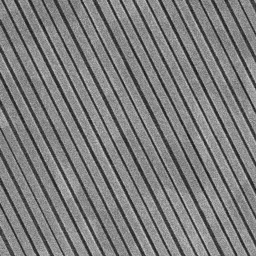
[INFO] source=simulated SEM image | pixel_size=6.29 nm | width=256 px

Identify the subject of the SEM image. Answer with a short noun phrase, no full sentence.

parallel lines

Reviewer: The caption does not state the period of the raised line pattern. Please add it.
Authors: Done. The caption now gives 73.9 nm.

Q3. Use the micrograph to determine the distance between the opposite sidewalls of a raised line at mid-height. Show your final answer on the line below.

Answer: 53.4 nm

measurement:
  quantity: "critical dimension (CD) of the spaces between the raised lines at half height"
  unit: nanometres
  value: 21.8